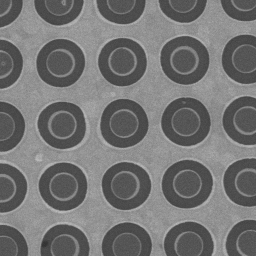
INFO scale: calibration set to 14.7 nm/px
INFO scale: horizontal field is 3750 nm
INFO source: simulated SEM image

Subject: an array of small figures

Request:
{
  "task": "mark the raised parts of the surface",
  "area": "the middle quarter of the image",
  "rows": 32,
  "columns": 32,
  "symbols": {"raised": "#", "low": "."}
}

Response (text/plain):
##...###...#######...###...#####
##...####...#####....###....####
#....####....###....#####.......
....######.........#######......
...########.......#########.....
..############..################
################################
################################
############################....
.###########......#########.....
....#######........#######......
.....#####..........#####....###
##...#####..######...####...####
##....###...######...###...#####
###...###...#######..###...#####
###...###...#######..###...#####
###...##....######...###....####
##....###....####....####....###
.....####...........######......
.....#####.........########.....
....#######......############...
.###############################
################################
################################
.#############...###########....
....########.......########.....
.....######.........######......
#....#####....###....####...####
###...###....#####....###...####
###...###...######....##...#####
###...###...#######...##....####
###...####..######....##....####